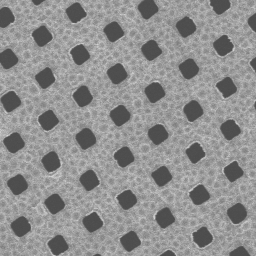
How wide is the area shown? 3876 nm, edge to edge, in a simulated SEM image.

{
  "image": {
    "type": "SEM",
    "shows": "a regular array of holes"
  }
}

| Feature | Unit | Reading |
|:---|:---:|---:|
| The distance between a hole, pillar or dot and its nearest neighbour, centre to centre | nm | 624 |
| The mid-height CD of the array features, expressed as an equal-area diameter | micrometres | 0.293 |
